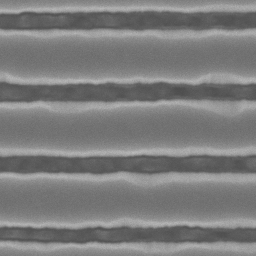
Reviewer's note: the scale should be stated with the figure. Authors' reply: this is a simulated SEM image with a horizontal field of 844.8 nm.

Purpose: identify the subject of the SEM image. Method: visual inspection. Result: lines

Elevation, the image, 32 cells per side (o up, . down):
oooooooooooooooooooooooooooooooo
ooo.............................
................................
................................
oooooooooooooooooooooooooooooooo
oooooooooooooooooooooooooooooooo
oooooooooooooooooooooooooooooooo
oooooooooooooooooooooooooooooooo
oooooooooooooooooooooooooooooooo
oooooooooooooooooooooooooooooooo
................................
................................
................................
oooooooooooooooooooooooooooooooo
oooooooooooooooooooooooooooooooo
oooooooooooooooooooooooooooooooo
oooooooooooooooooooooooooooooooo
oooooooooooooooooooooooooooooooo
oooooooooooooooooooooooooooooooo
........o.o.....................
................................
................................
oooooooooooooooooooooooooooooooo
oooooooooooooooooooooooooooooooo
oooooooooooooooooooooooooooooooo
oooooooooooooooooooooooooooooooo
oooooooooooooooooooooooooooooooo
oooooooooooooooooooooooooooooooo
........oo......................
................................
ooooo...oo.oo..o.......ooo.o....
oooooooooooooooooooooooooooooooo